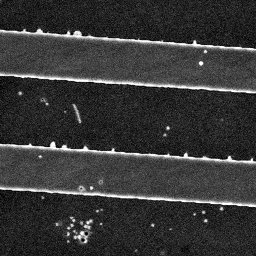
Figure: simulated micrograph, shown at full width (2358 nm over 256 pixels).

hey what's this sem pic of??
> lines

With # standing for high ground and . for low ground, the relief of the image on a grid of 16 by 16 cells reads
................
................
########........
################
################
............####
................
................
................
#######.........
################
################
..........######
................
................
................